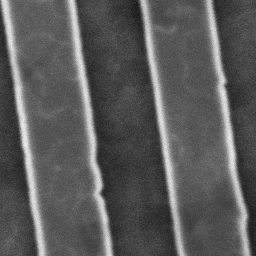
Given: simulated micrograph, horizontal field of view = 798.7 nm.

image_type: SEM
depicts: one or a few lines or trenches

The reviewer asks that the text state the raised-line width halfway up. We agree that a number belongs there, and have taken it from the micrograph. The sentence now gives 208 nm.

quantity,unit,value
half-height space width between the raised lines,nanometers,220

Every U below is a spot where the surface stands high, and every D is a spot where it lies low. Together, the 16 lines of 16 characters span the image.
UUUUUDDDDUUUUDDD
UUUUUDDDDUUUUDDD
DUUUUDDDDUUUUDDD
DUUUUDDDDUUUUUDD
DUUUUDDDDDUUUUDD
DUUUUDDDDDUUUUDD
DUUUUDDDDDUUUUDD
DUUUUUDDDDUUUUDD
DUUUUUDDDDUUUUDD
DDUUUUDDDDUUUUDD
DDUUUUDDDDDUUUUD
DDUUUUDDDDDUUUUD
DDUUUUDDDDDUUUUD
DDUUUUUDDDDUUUUD
DDUUUUUDDDDUUUUD
DDDUUUUDDDDUUUUD